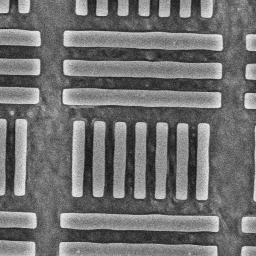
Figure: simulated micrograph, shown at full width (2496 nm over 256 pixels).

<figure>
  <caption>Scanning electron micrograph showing groups of lines, slits or small figures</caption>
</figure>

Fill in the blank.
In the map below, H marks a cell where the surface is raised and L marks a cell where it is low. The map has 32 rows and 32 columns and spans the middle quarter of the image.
HHHHHHHHHHHHHHHHHHHHHHHHHHHHHHHH
HHHHHHHHHHHHHHHHHHHHHHHHHHHHHHHH
HHHHHHHHHHHHHHHHHHHHHHHHHHHHHHHH
LLLLLLLLLLLLLLLLLLLLLLLLLLLLLLLL
LLLLLLLLLLLLLLLLLLLLLLLLLLLLLLLL
LLLLLLLLLLLLLLLLLLLLLLLLLLLLLLLL
HHHHHHHHHHLLLLLLLLLLLLLLLLLLLLLL
HHHHHHHHHHHHHHHHHHHHHHHHHHHHHHHH
HHHHHHHHHHHHHHHHHHHHHHHHHHHHHHHH
HHHHHHHHHHHHHHHHHHHHHHHHHHHHHHHH
LLLLLLLLLLLLLLLLLLLLLHHHLLHHHHHH
LLLLLLLLLLLLLLLLLLLLLLLLLLLLLLLL
LLLLLLLLLLLLLLLLLLLLLLLLLLLLLLLL
LLLLLLLLLLLLLLLLLLLLLLLLLLLLLLLL
LLLHHLLLHHLLLLLLLLLLLLLLLLLLLLLL
LLHHHLLHHHLLLHHHLLHHLLLHHHLLHHHL
LLHHHLLHHHLLLHHHLLHHLLLHHHLLHHHL
LLHHHLLHHHLLLHHHLLHHLLLHHHLLHHHL
LLHHHLLHHHLLLHHLLLHHLLLHHHLLHHHL
LLHHHLLHHHLLLHHLLLHHLLLHHHLLHHHL
LLHHHLLHHHLLLHHLLLHHLLLHHHLLHHHL
LLHHHLLHHHLLLHHLLLHHLLLHHHLLHHHL
LLHHHLLHHHLLLHHLLLHHLLLHHHLLHHHL
LLHHHLLHHHLLLHHLLLHHLLLHHLLLHHHL
LLHHHLLHHHLLLHHLLLHHLLLHHLLLHHHL
LLHHHLLHHHLLLHHLLLHHLLLHHLLLHHHL
LLHHHLLHHHLLLHHLLLHHLLLHHLLLHHHL
LLHHHLLHHHLLLHHLLLHHLLLHHLLLHHHL
LLHHHLLHHHLLLHHLLLHHLLLHHLLLHHHL
LLHHHLLHHHLLLHHLLLHHLLLHHLLLHHHL
LLHHHLLHHHLLHHHLLLHHLLLHHLLLHHHL
LLHHLLLHHHLLHHHLLLHHLLLHHLLLHHHL